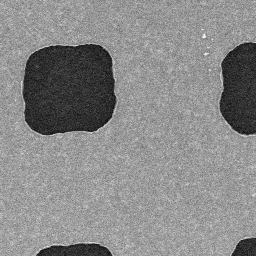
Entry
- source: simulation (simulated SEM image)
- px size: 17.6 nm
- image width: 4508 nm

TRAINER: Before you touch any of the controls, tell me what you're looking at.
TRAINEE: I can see holes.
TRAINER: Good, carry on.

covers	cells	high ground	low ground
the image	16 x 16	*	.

****************
****************
****************
**.....*******..
**.....*******..
*......*******..
**.....*******..
**.....*******..
****************
****************
****************
****************
****************
****************
****************
***....********.